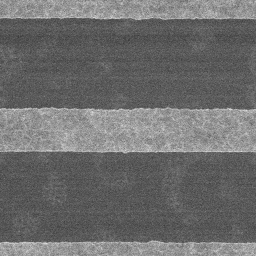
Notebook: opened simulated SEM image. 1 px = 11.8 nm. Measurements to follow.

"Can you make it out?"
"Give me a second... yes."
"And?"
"one or a few lines or trenches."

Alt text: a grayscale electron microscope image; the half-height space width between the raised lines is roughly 1070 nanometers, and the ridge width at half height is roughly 42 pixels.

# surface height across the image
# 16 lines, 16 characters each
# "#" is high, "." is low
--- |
################
................
................
................
................
................
................
################
################
.......#........
................
................
................
................
................
################